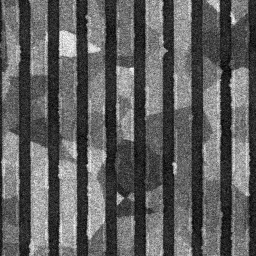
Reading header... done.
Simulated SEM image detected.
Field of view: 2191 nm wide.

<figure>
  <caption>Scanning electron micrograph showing parallel lines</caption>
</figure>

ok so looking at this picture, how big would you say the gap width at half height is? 102 nm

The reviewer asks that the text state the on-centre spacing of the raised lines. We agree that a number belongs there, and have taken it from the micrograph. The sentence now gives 246 nm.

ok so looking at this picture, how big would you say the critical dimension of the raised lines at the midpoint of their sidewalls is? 148 nm